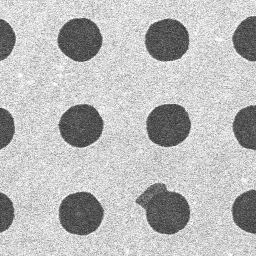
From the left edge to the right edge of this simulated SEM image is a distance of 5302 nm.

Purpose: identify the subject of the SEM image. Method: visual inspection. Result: holes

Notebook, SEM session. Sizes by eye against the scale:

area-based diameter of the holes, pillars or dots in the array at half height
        0.917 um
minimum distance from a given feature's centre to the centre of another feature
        84.6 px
